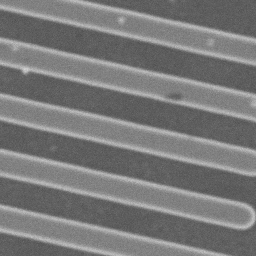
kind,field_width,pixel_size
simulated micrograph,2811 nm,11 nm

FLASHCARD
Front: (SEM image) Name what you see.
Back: groups of lines, slits or small figures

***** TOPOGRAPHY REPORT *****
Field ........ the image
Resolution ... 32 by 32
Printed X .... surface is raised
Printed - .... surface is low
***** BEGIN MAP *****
XXXXXXXXXXXX--------------------
--XXXXXXXXXXXXXXX---------------
-------XXXXXXXXXXXXXX-----------
-----------XXXXXXXXXXXXXXX------
---------------XXXXXXXXXXXXXXX--
XXXX----------------XXXXXXXXXXXX
XXXXXXXX----------------XXXXXXXX
XXXXXXXXXXXX-----------------XXX
--XXXXXXXXXXXXXXX---------------
-------XXXXXXXXXXXXXX-----------
-----------XXXXXXXXXXXXXXX------
----------------XXXXXXXXXXXXXX--
XXX-----------------XXXXXXXXXXXX
XXXXXXXX-----------------XXXXXXX
XXXXXXXXXXXXX----------------XXX
--XXXXXXXXXXXXXXX---------------
-------XXXXXXXXXXXXXX-----------
-----------XXXXXXXXXXXXXXX------
----------------XXXXXXXXXXXXXX--
XXXX----------------XXXXXXXXXXXX
XXXXXXXX-----------------XXXXXXX
XXXXXXXXXXXX-----------------XXX
---XXXXXXXXXXXXXX---------------
-------XXXXXXXXXXXXXXX----------
-----------XXXXXXXXXXXXXXX------
----------------XXXXXXXXXXXXXXX-
XXXX-----------------XXXXXXXXXXX
XXXXXXXX-----------------XXXXXXX
XXXXXXXXXXXXX-------------------
---XXXXXXXXXXXXXX---------------
-------XXXXXXXXXXXXXXX----------
------------XXXXXXXXXXXXXX------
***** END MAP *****